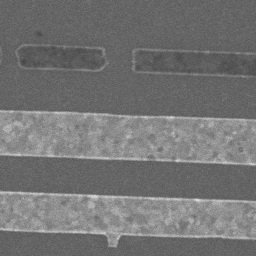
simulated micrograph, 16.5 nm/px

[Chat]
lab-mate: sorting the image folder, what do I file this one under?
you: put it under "one or a few lines or trenches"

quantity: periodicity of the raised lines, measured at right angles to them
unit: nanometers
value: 1290